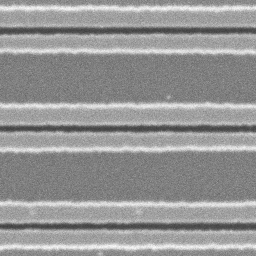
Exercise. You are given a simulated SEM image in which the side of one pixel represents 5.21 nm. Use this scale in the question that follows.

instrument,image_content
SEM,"lines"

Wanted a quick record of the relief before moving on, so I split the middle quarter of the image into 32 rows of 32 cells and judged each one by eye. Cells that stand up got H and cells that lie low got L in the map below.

LLLLLLLLLLLLLLLLLLLLLLLLLLLLLLLL
LLLLLLLLLLLLLLLLLLLLLLLLLLLLLLLL
LLLLLLLLLLLLLLLLLLLLLLLLLLLLLLLL
LLLLLLLLLLLLLLLLLLLLLLLLLLLLLLLL
LLLLLLLLLLLLLLLLLLLLLLLLLLLLLLLL
LLLLLLLLLLLLLLLLLLLLLLLLLLLLLLLL
LLLLLLLLLLLLLLLLLLLLLLLLLLLLLLLL
LLLLLLLLLLLLLLLLLLLLLLLLLLLLLLLL
LLLLLLLLLLLLLLLLLLLLLLLLLLLLLLLL
LLLLLLLLLLLLLLLLLLLLLLLLLLLLLLLL
LLLLLLLLLLLLHLLLHLLLLLLLLHLHLLLL
HHHHHHHHHHHHHHHHHHHHHHHHHHHHHHHH
HHHHHHHHHHHHHHHHHHHHHHHHHHHHHHHH
HHHHHHHHHHHHHHHHHHHHHHHHHHHHHHHH
HHHHHHHHHHHHHHHHHHHHHHHHHHHHHHHH
LLLLLLLLLLLLLLLLLLLLLLLLLLLLLLLL
LLLLLLLLLLLLLLLLLLLLLLLLLLLLLLLL
HHHHHHHHHHHHHHHHHHHHHHHHHHHHHHHH
HHHHHHHHHHHHHHHHHHHHHHHHHHHHHHHH
HHHHHHHHHHHHHHHHHHHHHHHHHHHHHHHH
HHHHHHHHHHHHHHHHHHHHHHHHHHHHHHHH
LLLLLLLLLLLLLLLLLLLLLLLLLLLLLLLL
LLLLLLLLLLLLLLLLLLLLLLLLLLLLLLLL
LLLLLLLLLLLLLLLLLLLLLLLLLLLLLLLL
LLLLLLLLLLLLLLLLLLLLLLLLLLLLLLLL
LLLLLLLLLLLLLLLLLLLLLLLLLLLLLLLL
LLLLLLLLLLLLLLLLLLLLLLLLLLLLLLLL
LLLLLLLLLLLLLLLLLLLLLLLLLLLLLLLL
LLLLLLLLLLLLLLLLLLLLLLLLLLLLLLLL
LLLLLLLLLLLLLLLLLLLLLLLLLLLLLLLL
LLLLLLLLLLLLLLLLLLLLLLLLLLLLLLLL
LLLLLLLLLLLLLLLLLLLLLLLLLLLLLLLL